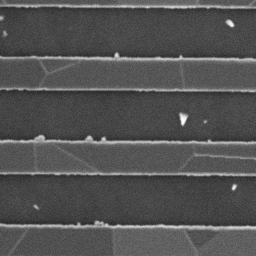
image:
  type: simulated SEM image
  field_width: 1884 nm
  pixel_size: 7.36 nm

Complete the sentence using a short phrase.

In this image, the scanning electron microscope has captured lines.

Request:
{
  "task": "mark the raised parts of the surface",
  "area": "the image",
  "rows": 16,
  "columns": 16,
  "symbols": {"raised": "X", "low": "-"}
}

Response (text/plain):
----------------
----------------
----------------
----------------
XXXXXXXXXXXXXXXX
XXXXXXXXXXXXXXXX
----------------
----------------
----------------
XXXXXXXXXXXXXXXX
XXXXXXXXXXXXXXXX
----------------
----------------
----------------
XXXXXXXXXXXXXXXX
XXXXXXXXXXXXXXXX